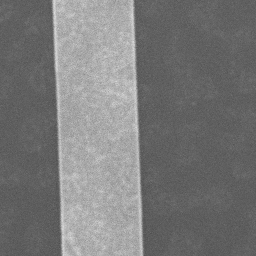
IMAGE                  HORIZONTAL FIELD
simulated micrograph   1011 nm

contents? one or a few lines or trenches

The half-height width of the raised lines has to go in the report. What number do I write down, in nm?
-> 308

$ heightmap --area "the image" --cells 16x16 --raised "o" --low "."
...ooooo........
...ooooo........
...ooooo........
....oooo........
....oooo........
....oooo........
....oooo........
....ooooo.......
....ooooo.......
....ooooo.......
....ooooo.......
....ooooo.......
....ooooo.......
....ooooo.......
....ooooo.......
....ooooo.......